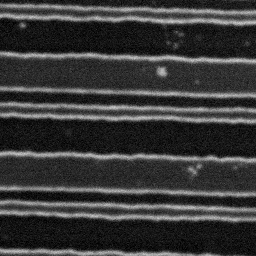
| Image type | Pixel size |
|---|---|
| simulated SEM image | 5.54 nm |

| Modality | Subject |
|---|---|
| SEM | lines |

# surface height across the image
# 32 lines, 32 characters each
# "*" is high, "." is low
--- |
********************************
********************************
..............*...**************
................................
................................
................................
................................
****************************.*..
********************************
********************************
********************************
********************************
********************************
********************************
....*.**************************
................................
................................
................................
................................
************.....*..............
********************************
********************************
********************************
********************************
********************************
********************************
********************************
................................
................................
................................
................................
*********.......................